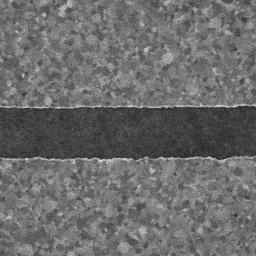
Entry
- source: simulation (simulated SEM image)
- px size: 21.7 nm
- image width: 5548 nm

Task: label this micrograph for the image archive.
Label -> one or a few lines or trenches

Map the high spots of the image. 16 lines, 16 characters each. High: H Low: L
HHHHHHHHHHHHHHHH
HHHHHHHHHHHHHHHH
HHHHHHHHHHHHHHHH
HHHHHHHHHHHHHHHH
HHHHHHHHHHHHHHHH
HHHHHHHHHHHHHHHH
HHHHHHHHHHHHHHHH
LLLLLLLLLLLLLLLL
LLLLLLLLLLLLLLLL
LLLLLLLLLLLLLLLL
HHHHHHHHHHHHHHHH
HHHHHHHHHHHHHHHH
HHHHHHHHHHHHHHHH
HHHHHHHHHHHHHHHH
HHHHHHHHHHHHHHHH
HHHHHHHHHHHHHHHH